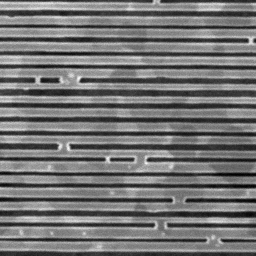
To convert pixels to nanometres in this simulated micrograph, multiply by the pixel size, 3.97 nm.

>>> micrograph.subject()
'parallel lines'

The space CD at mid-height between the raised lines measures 25.8 nanometers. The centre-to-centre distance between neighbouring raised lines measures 53 nanometres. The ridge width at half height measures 29.8 nm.